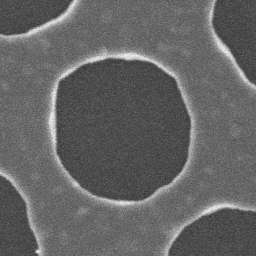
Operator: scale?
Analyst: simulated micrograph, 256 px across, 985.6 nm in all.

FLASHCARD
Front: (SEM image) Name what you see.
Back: holes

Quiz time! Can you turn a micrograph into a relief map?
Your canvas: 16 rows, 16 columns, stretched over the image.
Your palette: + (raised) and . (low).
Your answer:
....+++++++++...
...++++++++++...
++++++++++++++..
++++++++++++++..
++++......+++++.
++++.......+++++
+++.........++++
+++.........++++
+++.........++++
++++........++++
++++.......+++++
.++++.....++++++
..+++++..+++++++
..+++++++++++...
..+++++++++.....
..+++++++++.....